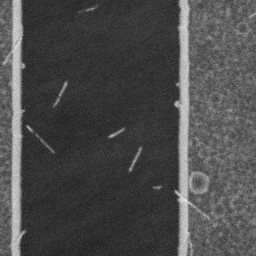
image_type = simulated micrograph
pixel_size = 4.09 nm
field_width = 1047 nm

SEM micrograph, one or a few lines or trenches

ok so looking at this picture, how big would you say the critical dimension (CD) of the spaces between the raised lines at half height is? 686 nm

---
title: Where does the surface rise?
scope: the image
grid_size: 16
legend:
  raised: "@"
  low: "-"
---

@-----------@@@@
@----------@@@@@
@-----------@@@@
@-----------@@@@
@-----------@@@@
@-----------@@@@
@-----------@@@@
@-----------@@@@
@-----------@@@@
@-----------@@@@
@-----------@@@@
@----------@@@@@
@----------@@@@@
@-----------@@@@
@-----------@@@@
@----------@@@@@